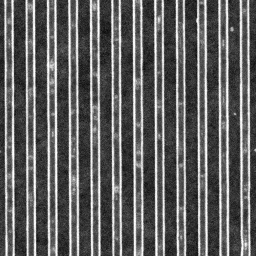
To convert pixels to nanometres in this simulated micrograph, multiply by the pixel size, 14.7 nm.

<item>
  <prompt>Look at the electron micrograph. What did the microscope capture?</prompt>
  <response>parallel lines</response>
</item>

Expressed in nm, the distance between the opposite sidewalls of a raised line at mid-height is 116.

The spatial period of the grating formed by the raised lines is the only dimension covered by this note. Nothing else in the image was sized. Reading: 315 nanometers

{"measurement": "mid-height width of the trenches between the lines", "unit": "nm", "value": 200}